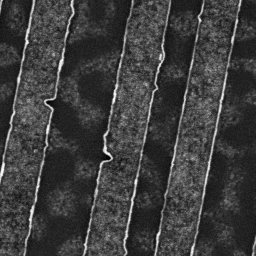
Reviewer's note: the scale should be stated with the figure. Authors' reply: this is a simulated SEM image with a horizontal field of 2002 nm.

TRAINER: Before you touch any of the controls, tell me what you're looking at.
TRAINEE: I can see one or a few lines or trenches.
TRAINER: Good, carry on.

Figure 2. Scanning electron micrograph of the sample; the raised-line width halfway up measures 301 nanometres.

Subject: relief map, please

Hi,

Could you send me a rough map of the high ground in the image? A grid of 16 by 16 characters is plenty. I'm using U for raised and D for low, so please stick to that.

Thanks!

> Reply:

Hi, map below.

DDUUUDDDUUUDDUUD
DDUUDDDDUUDDUUUD
DDUUDDDDUUDDUUUD
DUUUDDDDUUDDUUDD
DUUUDDDUUUDDUUDD
DUUUDDDUUUDDUUDD
DUUDDDDUUDDUUUDD
DUUDDDDUUDDUUUDD
DUUDDDDUUDDUUDDD
UUUDDDDUUDDUUDDD
UUUDDDUUUDDUUDDD
UUDDDDUUUDDUUDDD
UUDDDDUUDDUUUDDD
UUDDDDUUDDUUUDDD
UUDDDUUUDDUUDDDD
UUDDDUUUDDUUDDDD